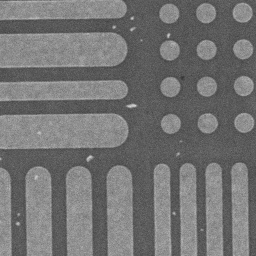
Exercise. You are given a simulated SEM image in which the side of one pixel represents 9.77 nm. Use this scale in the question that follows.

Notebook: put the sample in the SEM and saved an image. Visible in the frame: groups of lines, slits or small figures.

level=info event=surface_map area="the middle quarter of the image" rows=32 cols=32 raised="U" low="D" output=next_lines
DDDDDDDDDDDDDDDDDDDDDDDDDDDDDDDD
DDDDDDDDDDDDDDDDDDDDDDDDDDDDDDDD
DDDDDDDDDDDDDDDDDDDDDDDDDDDDDDDD
DDDDDDDDDDDDDDDDDDDDDDDDDDDDDDDD
DDDDUUUUUUUUUUUDDDDDDDDDDUUUUDDD
UUUUUUUUUUUUUUUUDDDDDDDDUUUUUDDD
UUUUUUUUUUUUUUUUDDDDDDDDUUUUUDDD
UUUUUUUUUUUUUUUUDDDDDDDDDUUUDDDD
UUUUUUUUUUUUUUDDDDDDDDDDDDDDDDDD
DDDDDDDDDDDDDDDDDDDDDDDDDDDDDDDD
DDDDDDDDDDDDDDDDUUDDDDDDDDDDDDDD
DDDDDDDDDDDDDDDDDDDDDDDDDDDDDDDD
DDDDDDDDDDDDDDDDDDDDDDDDDDDDDDDD
UUUUUUUUUUUUUUDDDDDDDDDDDUUUUDDD
UUUUUUUUUUUUUUUDDDDDDDDDUUUUUDDD
UUUUUUUUUUUUUUUUDDDDDDDDUUUUUDDD
UUUUUUUUUUUUUUUUDDDDDDDDDUUUUDDD
UUUUUUUUUUUUUUUUDDDDDDDDDDDDDDDD
UUUUUUUUUUUUUUUUDDDDDDDDDDDDDDDD
UUUUUUUUUUUUUUUDDDDDDDDDDDDDDDDD
UUUUUUUUUUUUUDDDDDDDDDDDDDDDDDDD
DDDDDDDDDDDDDDDDDDDDDDDDDDDDDDDD
DDDDDDDDDDDDDDDDDDDDDDDDDDDDDDDD
DDDDDDUDDDDDDDDDDDDDDDDDDDDDDDDD
DDDDDDDDDDDDDDDDDDDDDDDDDDDDDDDD
DDDDDDDDDDDDDDDDDDDDDDDUUUDDDDUU
DDUUUUDDDDDDUUUUDDDDDDDUUUDDDUUU
DUUUUUUDDDDUUUUUUDDDDDDUUUDDDUUU
DUUUUUUDDDDUUUUUUDDDDDDUUUDDDUUU
DUUUUUUDDDDUUUUUUDDDDDDUUUDDDUUU
DUUUUUUDDDDUUUUUUDDDDDDUUUDDDUUU
DUUUUUUDDDDUUUUUUDDDDDDUUUDDDUUU